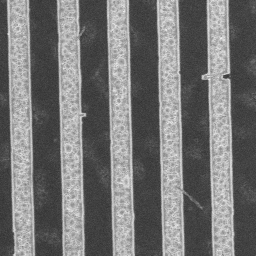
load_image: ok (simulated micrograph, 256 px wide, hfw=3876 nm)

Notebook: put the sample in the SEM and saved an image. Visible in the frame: parallel lines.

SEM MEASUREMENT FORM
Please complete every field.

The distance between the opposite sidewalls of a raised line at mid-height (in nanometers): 295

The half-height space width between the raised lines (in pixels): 30.2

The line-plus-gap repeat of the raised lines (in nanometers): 754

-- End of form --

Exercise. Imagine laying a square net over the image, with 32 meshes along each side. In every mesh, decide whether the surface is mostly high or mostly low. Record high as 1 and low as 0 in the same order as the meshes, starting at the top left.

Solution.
01100001110001110000110000110000
01110001110000110000110000110000
01100001110000110000110000110000
01110001110000110000110000110000
01110001110000110000110000111000
01110000110000110000110000110000
01110001110000110000110000110000
01110001110000110000110000110000
01110000110000110000110000110000
01110000110000110000110000110000
01110000110000110000110000111000
01110000110000110000110000111000
01110000110000110000110000111000
01110000110000110000110000111000
01110000110000110000111000111000
01110000110000110000111000111000
01110000110000110000111000111000
00110000110000110000111000111000
00110000110000110000111000111000
01110000110000110000111000111000
00110000110000110000111000111000
00110000110000110000111000111000
00110000110000110000111000111000
00110000110000110000111000011000
00110000110000110000111000011000
00110000110000111000111000011000
00110000110000111000111000011000
00110000110000111000111000011000
00110000110000111000111000011000
00110000110000111000111000011000
00110000110000111000111000011000
00110000110000111000011000011000